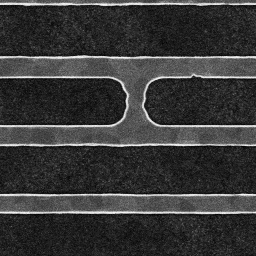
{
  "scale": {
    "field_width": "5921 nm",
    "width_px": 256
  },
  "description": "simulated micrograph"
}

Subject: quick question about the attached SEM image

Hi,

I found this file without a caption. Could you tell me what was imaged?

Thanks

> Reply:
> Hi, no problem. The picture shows one or a few lines or trenches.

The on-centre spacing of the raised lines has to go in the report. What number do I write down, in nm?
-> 1580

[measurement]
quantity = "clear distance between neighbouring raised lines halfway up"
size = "50 pixels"